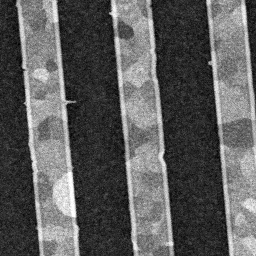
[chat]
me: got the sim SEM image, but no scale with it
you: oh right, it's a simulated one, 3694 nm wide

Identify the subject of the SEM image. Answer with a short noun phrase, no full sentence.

one or a few lines or trenches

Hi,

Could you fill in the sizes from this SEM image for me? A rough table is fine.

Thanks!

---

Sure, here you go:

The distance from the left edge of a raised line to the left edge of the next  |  1360 nanometers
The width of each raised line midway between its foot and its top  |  0.494 µm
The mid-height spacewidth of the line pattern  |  0.866 microns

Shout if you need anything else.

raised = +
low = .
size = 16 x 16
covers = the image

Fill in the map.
.++....++....++.
.++....++....++.
.+++...++....++.
..++...+++...++.
..++....++...+++
..++....++....++
..++....++....++
..++....++....++
..++....++....++
..++....++....++
..++....++....++
..++....++....++
..++....++....++
..+++...+++...++
...++...+++...++
...++...+++...++